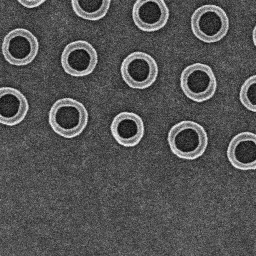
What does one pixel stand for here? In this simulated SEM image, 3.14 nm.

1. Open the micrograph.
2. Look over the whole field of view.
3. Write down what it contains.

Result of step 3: ring-shaped raised bodies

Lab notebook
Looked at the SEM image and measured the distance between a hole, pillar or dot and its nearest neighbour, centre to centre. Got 188 nm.